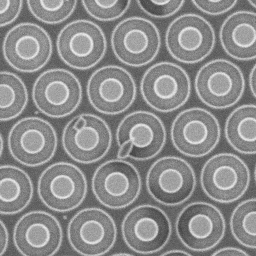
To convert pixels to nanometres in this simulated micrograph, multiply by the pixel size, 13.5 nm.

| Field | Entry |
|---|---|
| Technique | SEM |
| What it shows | an array of small figures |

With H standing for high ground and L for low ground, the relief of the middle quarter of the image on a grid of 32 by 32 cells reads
HHLLLLLHHHHHHHHHHHHHHHHLLLLLHHHH
HHHHHHHHHLLLLLLHHHHHHLLLLLLLLHHH
LLHHHHHHLLLLLLLLHHHHHLLLLLLLLLHH
LLLHHHHLLLLLLLLLLHHHLLLLHHHLLLLH
LLLHHHLLLLHHHHLLLHHHLLLHHHHHLLLH
LLLLHHLLLHHHHHLLLHHHLLLHHHHHLLLH
HLLLHHLLLHHHHHHLLLHHLLLHHHHHLLLH
HLLLHHLLLHHHHHLLLLHHLLLHHHHLLLLH
HLLLHHHLLLHHHHLLLHHHLLLLLLLLLLLH
LLLLHHHLLLLLLLLLLHHHHLLLLLLLLLHH
LLLHHHHHLLLLLLLLHHHHHHLLLLLLLHHH
LLHHHHHHHLLLLLLHHHHHHHHHLLHHHHHH
HHHHHHHHHHHHHHHHHHLLLHHHHHHHHLLL
HHHHHLLLHHHHHHHHLLLLLLLHHHHHLLLL
HHLHHLLLLLHHHHHLLLLLLLLLHHHHLLLL
HLLHHLLLLLLHHHLLLLHHLLLLHHHLLLLH
LLLHHHHLLLLHHHLLLHHHHHLLLHHLLLHH
LLLHHHHHLLLHHHLLLHHHHHLLLHHLLLHH
LLLHHHHHLLLHHLLLLHHHHHLLLHHLLLHH
LLLHHHHHLLLHHHLHHHHHHHLLLHHHLLLL
LLLLHHHHLLLHHHHHHLLHLLLLHHHHLLLL
HLLLLLLLLLLHHHHHHLLLLLLLHHHHHLLL
HLLLLLLLLLHHHHHHLLLLLLLHHHHHHHHL
HHHLLLLLLHHHHHHHHHLLLHHHHHLHHHHH
HHHHHLHHHHHHLLLHHHHHHHHLLLLLLLHH
LLHHHHHHHHLLLLLLLHHHHHLLLLLLLLLH
LLLHHHHHHLLLLLLLLLHHHHLLLLLLLLLL
LLLLHHHHLLLLHHLLLLHHHLLLLHHHHLLL
HLLLLHHHLLLHHHHHLLLHHLLLHHHHHLLL
HHLLLHHLLLHHHHHHLLLHHLLLHHHHHHLL
HHLLLHHLLLHHHHHHLLLHHLLLHHHHHLLL
HHLLLHHHLLLHHHHHLLLHHLLLLHHHLLLL